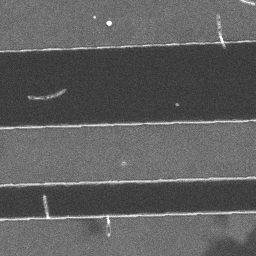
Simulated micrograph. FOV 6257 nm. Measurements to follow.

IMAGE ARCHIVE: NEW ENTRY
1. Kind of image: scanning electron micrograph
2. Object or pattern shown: lines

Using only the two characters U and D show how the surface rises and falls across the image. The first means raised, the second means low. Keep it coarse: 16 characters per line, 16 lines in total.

DDDDDDDDDDDDDDDD
DDDDDDDDDDDDDDDD
DDDDDDDDDDDDDDDD
UUUUUUUUUUUUUUUU
UUUUUUUUUUUUUUUU
UUUUUUUUUUUUUUUU
UUUUUUUUUUUUUUUU
UUUUUUUUUUUUUUUU
DDDDDDDDDDDDDDDD
DDDDDDDDDDDDDDDD
DDDDDDDDDDDDDDDD
DDDUUUUUUUUUUUUU
UUUUUUUUUUUUUUUU
UUUUUUUUDDDDDDDD
DDDDDDDDDDDDDDDD
DDDDDDDDDDDDDDDD